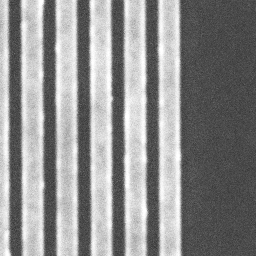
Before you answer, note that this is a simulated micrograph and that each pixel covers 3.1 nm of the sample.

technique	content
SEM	parallel lines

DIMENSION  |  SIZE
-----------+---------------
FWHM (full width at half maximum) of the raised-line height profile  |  61.3 nm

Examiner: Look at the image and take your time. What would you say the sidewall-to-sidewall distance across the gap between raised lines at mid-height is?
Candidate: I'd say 0.045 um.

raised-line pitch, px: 34.3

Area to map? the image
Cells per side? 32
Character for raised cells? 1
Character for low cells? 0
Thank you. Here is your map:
10011001100111001100110000000000
10011001100111001100110000000000
10011001100111001100110000000000
10011001110111001100110000000000
10011001110111001100110000000000
10011001100111001100110000000000
10011001100111001100110000000000
10011001100111001100110000000000
10011001110111001100110000000000
10011001110111001100110000000000
10011001110111001100110000000000
10011001110111001100110000000000
10011001100111001100110000000000
10011001110111001100110000000000
10011001110111001100110000000000
10011001110011001100110000000000
10011001110011001100110000000000
10011001110011001100110000000000
10011001110011001100110000000000
10011001110011001100110000000000
10011001110011001100110000000000
10011001110011001100110000000000
10011001100011001100110000000000
10011001100111001100110000000000
10011001110011001100110000000000
10011001110011001100110000000000
10011001100011001100110000000000
10011001110011001100110000000000
10011001110011001100110000000000
10011001110011001100110000000000
10011001110111001100110000000000
10011001110111001100110000000000